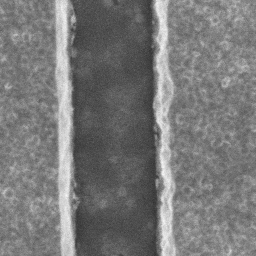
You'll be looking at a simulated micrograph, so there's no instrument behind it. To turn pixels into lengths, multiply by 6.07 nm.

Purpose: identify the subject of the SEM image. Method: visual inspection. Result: one or a few lines or trenches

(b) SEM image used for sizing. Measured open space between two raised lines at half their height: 600 nanometers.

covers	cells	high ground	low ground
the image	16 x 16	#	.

####......######
####......######
####......######
####......######
####......######
####......######
####......######
####......######
####......######
####......######
####......######
####.......#####
####......######
####......######
####......######
####......######